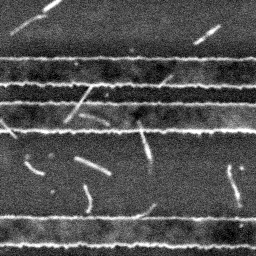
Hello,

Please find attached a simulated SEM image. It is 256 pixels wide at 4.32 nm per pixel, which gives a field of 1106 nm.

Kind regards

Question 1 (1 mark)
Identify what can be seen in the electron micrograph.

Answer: lines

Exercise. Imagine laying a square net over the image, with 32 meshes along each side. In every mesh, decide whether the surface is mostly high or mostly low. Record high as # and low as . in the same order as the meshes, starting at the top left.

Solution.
................................
................................
................................
................................
................................
................................
................................
################################
################################
################################
#.#.############################
................................
................................
################################
################################
################################
#....###.#######.#..#.#####....#
................................
................................
................................
................................
................................
................................
................................
................................
................................
................................
################################
################################
################################
################################
................................